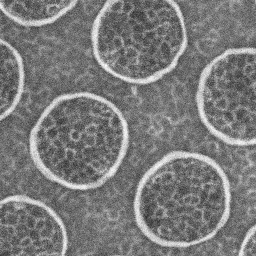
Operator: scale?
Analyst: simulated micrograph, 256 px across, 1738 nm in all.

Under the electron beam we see raised bodies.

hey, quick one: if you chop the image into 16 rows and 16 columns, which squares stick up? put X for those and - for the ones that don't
XXXX---XXXX-----
------XXXXX-----
------XXXXXX----
X-----XXXXX---XX
X------XXX---XXX
X------------XXX
X--XXXX------XXX
---XXXXX-----XXX
--XXXXXX------XX
--XXXXXX--------
---XXXX---XXXX--
----XX---XXXXX--
-X-------XXXXX--
XXX------XXXXX--
XXXX-----XXXX---
XXXX-----------X